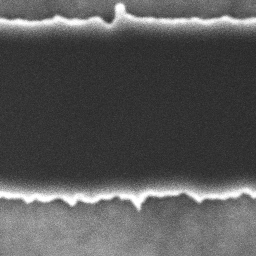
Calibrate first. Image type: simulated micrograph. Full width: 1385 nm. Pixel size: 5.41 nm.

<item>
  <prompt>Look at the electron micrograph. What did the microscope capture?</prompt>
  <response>one or a few lines or trenches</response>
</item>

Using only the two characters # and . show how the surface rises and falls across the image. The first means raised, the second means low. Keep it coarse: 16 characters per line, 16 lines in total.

................
################
################
################
################
################
################
################
################
################
################
################
....##..#.......
................
................
................